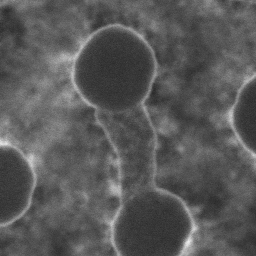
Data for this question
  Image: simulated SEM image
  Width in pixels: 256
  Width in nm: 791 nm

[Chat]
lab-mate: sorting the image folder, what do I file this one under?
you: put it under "raised bodies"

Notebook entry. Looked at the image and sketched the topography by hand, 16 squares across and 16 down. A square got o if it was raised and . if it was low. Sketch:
................
................
.....oooo.......
.....ooooo......
.....ooooo......
.....oooo......o
......ooo......o
......ooo.....oo
.......ooo.....o
o......ooo......
oo.....ooo......
oo.....ooo......
oo......ooo.....
o......ooooo....
.......ooooo....
.......ooooo....